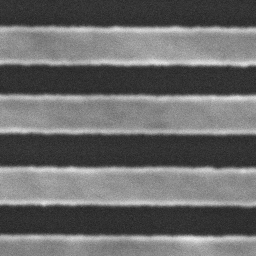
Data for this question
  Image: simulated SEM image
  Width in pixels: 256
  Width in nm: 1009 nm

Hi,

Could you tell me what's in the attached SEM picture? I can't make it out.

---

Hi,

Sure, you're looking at lines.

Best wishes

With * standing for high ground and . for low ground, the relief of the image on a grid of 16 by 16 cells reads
................
................
****************
****************
................
................
****************
****************
................
................
*****.**.***....
****************
****************
................
................
****************